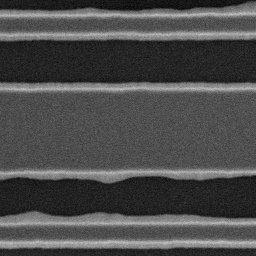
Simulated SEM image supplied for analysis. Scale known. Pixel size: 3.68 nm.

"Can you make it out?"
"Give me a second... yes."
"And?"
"lines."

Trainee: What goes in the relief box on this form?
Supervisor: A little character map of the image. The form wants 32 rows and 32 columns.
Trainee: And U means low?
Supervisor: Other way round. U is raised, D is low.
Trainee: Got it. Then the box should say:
DDDDDDDDDDDDDDDDDDDDDDDDDDDDDDDD
DDDDDDDDDDDDDDDDDDDDDDDDDUUDUUUU
UUUUUUUUUUUUUUUUUUUUUUUUUUUUUUUU
UUUUUUUUUUUUUUUUUUUUUUUUUUUUUUUU
UUUUDDUUUUUDDDDDDDUDUDDDDDDDDDDD
DDDDDDDDDDDDDDDDDDDDDDDDDDDDDDDD
DDDDDDDDDDDDDDDDDDDDDDDDDDDDDDDD
DDDDDDDDDDDDDDDDDDDDDDDDDDDDDDDD
DDDDDDDDDDDDDDDDDDDDDDDDDDDDDDDD
DDDDDDDDDDDDDDDDDDDDDDDDDDDDDDDD
DDDDDDDDDDDDDDDDDDDDDDDDDDDDDDDD
UUUUUUUUUUUUUUUUUUUUUUUUUUUUUUUU
UUUUUUUUUUUUUUUUUUUUUUUUUUUUUUUU
UUUUUUUUUUUUUUUUUUUUUUUUUUUUUUUU
UUUUUUUUUUUUUUUUUUUUUUUUUUUUUUUU
UUUUUUUUUUUUUUUUUUUUUUUUUUUUUUUU
UUUUUUUUUUUUUUUUUUUUUUUUUUUUUUUU
UUUUUUUUUUUUUUUUUUUUUUUUUUUUUUUU
UUUUUUUUUUUUUUUUUUUUUUUUUUUUUUUU
UUUUUUUUUUUUUUUUUUUUUUUUUUUUUUUU
UUUUUUUUUUUUUUUUUUUUUUUUUUUUUUUU
UUUUUUUUUUUUUUUUUUUUUUUUUUUUUUUU
DDDDDDDDDDDDDDDDDDDDDDDDDDDDDDDD
DDDDDDDDDDDDDDDDDDDDDDDDDDDDDDDD
DDDDDDDDDDDDDDDDDDDDDDDDDDDDDDDD
DDDDDDDDDDDDDDDDDDDDDDDDDDDDDDDD
DDDDDDDDDDDDDDDDDDDDDDDDDDDDDDDD
DDDUUUDDDDDUUDUDDDDDDDDDDDDDDDDD
UUUUUUUUUUUUUUUUUUUUUUUUUUUUUUUU
UUUUUUUUUUUUUUUUUUUUUUUUUUUUUUUU
UUUUDUUUDUUUDDDDUUUDUUDDDDDDDDUU
DDDDDDDDDDDDDDDDDDDDDDDDDDDDDDDD